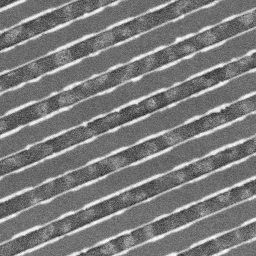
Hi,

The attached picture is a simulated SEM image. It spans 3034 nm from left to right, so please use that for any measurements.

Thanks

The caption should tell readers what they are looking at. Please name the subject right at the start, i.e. parallel lines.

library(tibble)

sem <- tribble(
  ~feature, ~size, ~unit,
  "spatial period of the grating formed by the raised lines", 460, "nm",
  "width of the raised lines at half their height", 276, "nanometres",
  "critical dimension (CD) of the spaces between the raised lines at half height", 190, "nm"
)